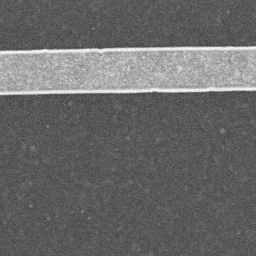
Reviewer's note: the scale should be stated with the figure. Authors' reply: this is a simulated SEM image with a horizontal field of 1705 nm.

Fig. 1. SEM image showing one or a few lines or trenches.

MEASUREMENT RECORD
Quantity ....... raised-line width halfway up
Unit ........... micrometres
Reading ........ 0.272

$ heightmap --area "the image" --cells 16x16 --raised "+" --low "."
................
................
................
++++++++++++++++
++++++++++++++++
++++++++++++++++
................
................
................
................
................
................
................
................
................
................